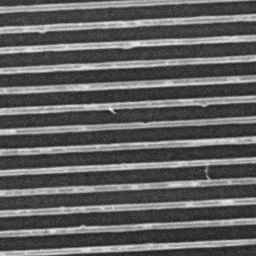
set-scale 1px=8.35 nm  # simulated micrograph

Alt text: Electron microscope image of parallel lines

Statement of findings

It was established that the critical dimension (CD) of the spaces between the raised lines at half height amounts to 125 nm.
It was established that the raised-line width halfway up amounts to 0.0459 microns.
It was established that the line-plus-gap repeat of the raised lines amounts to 170 nm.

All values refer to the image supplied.